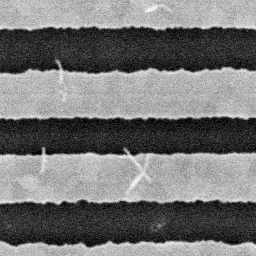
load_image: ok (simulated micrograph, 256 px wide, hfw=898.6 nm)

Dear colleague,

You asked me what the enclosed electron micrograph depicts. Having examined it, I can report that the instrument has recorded lines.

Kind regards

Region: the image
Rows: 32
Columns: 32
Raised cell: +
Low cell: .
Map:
++++++++++++++++++++++++++++++++
++++++++++++++++++++++++++++++++
++++++++++++++++++++++++++++++++
++.++..............++..........+
................................
................................
................................
................................
............................+...
++++++++++++++++++++++++++++++++
++++++++++++++++++++++++++++++++
++++++++++++++++++++++++++++++++
++++++++++++++++++++++++++++++++
++++++++++++++++++++++++++++++++
+++++++++++++++++++++++++++.++++
................................
................................
................................
................................
++++++++++++++++++++++++++++++++
++++++++++++++++++++++++++++++++
++++++++++++++++++++++++++++++++
++++++++++++++++++++++++++++++++
++++++++++++++++++++++++++++++++
++++++++++++++++++++++++++++++++
................................
................................
................................
................................
................................
+..+++.......+++++++++++++++..++
++++++++++++++++++++++++++++++++